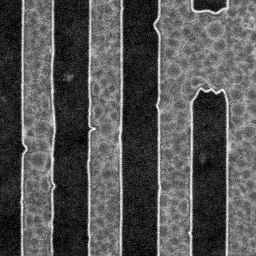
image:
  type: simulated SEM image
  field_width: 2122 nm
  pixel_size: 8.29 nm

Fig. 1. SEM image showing one or a few lines or trenches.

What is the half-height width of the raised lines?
310 nm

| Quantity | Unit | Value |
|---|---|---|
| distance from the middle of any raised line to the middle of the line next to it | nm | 579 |